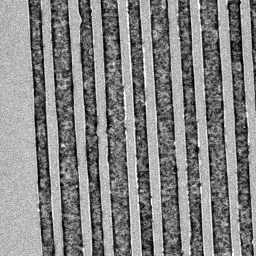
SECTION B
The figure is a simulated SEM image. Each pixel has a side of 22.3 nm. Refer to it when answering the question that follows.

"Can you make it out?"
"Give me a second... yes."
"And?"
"parallel lines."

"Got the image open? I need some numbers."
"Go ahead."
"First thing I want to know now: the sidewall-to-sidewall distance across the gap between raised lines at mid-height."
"303 nm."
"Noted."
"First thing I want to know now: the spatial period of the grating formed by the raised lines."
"0.559 micrometres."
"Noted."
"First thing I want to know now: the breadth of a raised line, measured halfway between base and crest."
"203 nm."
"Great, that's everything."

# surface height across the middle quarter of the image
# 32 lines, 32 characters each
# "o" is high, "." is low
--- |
..oo....oo.....oo...oo.....oo...
..oo....oo.....oo...oo.....oo...
..oo....oo.....oo...oo.....oo...
..oo....oo.....oo...oo.....oo...
..ooo...oo.....oo...oo.....oo...
...oo...oo.....oo...ooo....ooo..
...oo...oo.....oo....oo....ooo..
...oo...oo.....oo....oo....ooo..
...oo...oo.....oo....oo....ooo..
...oo...oo.....oo....oo....ooo..
...oo...oo.....oo....oo.....oo..
...oo...oo.....oo....oo.....oo..
...oo...oo.....oo....oo.....oo..
...oo...oo.....oo....oo.....oo..
...oo...ooo.....o....oo.....oo..
...oo...ooo.....o....oo.....oo..
...oo...oo......o....oo.....oo..
...oo...oo......oo...oo.....oo..
...oo....oo.....oo...oo.....oo..
...oo....oo.....oo...oo.....oo..
...oo....oo.....oo...oo.....oo..
...oo....oo.....oo...oo.....oo..
...ooo...oo.....oo...oo.....oo..
....oo...oo.....oo...ooo....oo..
....oo...oo.....oo....oo....oo..
....oo...oo.....oo....oo....oo..
....oo...oo.....oo....oo....ooo.
....oo...oo.....oo....oo.....oo.
....oo...oo.....oo....oo.....oo.
....oo...oo.....oo....oo.....oo.
....oo...oo.....oo....oo.....oo.
....oo...oo.....oo....oo.....oo.